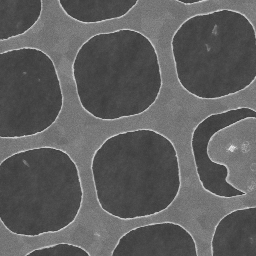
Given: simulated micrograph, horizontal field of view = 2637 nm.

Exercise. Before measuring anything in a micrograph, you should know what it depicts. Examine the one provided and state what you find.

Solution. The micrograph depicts holes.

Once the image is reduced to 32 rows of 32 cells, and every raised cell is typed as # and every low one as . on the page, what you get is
.....###.........###############
.....###........###########..###
.....#####...##########........#
....##################..........
..##########......####..........
###########........###..........
#....#####.........###..........
......###...........##..........
.......##...........##..........
.......##...........##..........
.......###..........###........#
........##..........####......##
........##.........#############
........###.......############.#
.......#####....##########......
......###################....###
.....###########...#####...#####
#############........###..######
############..........##..######
#........###..........##..######
.........###..........##...#####
..........##..........###...####
..........##..........###...####
..........##..........####...###
..........##..........#####..###
..........###........###########
..........###.......#########...
.........###################....
#.......#########......####.....
###############.........###.....
###############.........##......
####.......###...........##.....